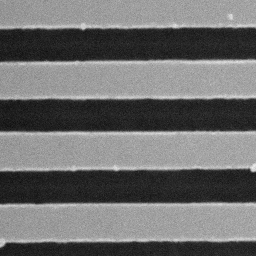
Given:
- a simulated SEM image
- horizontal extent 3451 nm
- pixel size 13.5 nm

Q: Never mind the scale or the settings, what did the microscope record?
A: lines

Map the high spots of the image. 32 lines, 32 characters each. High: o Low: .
oooooooooooooooooooooooooooooooo
oooooooooooooooooooooooooooooooo
oooooooooooooooooooooooooooooooo
o.....o...o.....................
................................
................................
................................
................................
oooooooooooooooooooooooooooooooo
oooooooooooooooooooooooooooooooo
oooooooooooooooooooooooooooooooo
oooooooooooooooooooooooooooooooo
................................
................................
................................
................................
................................
oooooooooooooooooooooooooooooooo
oooooooooooooooooooooooooooooooo
oooooooooooooooooooooooooooooooo
oooooooooooooooooooooooooooooooo
................................
................................
................................
................................
.......ooooooooooooooooooooooooo
oooooooooooooooooooooooooooooooo
oooooooooooooooooooooooooooooooo
oooooooooooooooooooooooooooooooo
oooooooooooooooooooooooooooooooo
o...............................
................................